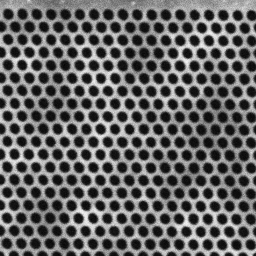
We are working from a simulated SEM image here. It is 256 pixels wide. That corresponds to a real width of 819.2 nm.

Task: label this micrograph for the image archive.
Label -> a regular array of holes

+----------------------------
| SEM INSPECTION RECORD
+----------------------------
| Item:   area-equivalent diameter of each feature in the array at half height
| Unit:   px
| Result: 10.7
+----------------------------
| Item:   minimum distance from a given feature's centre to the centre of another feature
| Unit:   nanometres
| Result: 44.8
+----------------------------